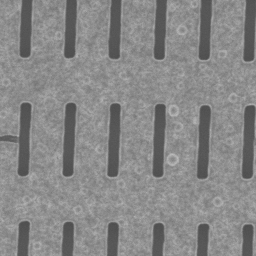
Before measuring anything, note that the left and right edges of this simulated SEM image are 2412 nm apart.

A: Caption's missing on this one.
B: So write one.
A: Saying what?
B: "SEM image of holes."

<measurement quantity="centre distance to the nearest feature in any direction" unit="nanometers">422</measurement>